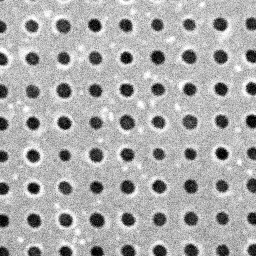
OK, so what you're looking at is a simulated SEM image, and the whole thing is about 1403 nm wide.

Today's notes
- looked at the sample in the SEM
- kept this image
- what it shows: a regular array of holes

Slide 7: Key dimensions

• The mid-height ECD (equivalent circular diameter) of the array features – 85.5 nanometers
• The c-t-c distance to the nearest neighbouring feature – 171 nanometres